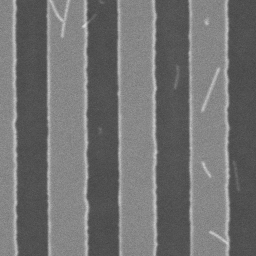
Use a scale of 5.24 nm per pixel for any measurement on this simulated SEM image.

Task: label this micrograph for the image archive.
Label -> lines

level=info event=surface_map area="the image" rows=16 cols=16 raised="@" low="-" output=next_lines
@--@@--@@@--@@--
@--@@--@@@--@@--
@--@@--@@@--@@--
@--@@--@@@--@@--
@--@@--@@@--@@--
@--@@--@@@--@@--
@--@@--@@@--@@--
@--@@--@@@--@@--
@--@@--@@@--@@--
@--@@--@@@--@@--
@--@@--@@@--@@--
@--@@--@@@--@@--
@--@@--@@@--@@--
@--@@--@@@--@@--
@--@@--@@@--@@--
@--@@--@@@--@@--